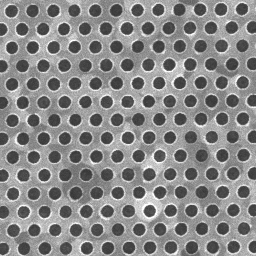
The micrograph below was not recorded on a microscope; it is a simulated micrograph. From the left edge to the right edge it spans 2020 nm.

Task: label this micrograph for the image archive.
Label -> a regular array of holes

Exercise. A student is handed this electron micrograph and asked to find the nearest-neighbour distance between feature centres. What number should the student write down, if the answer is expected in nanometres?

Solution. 164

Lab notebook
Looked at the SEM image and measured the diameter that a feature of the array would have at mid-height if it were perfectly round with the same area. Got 101 nm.